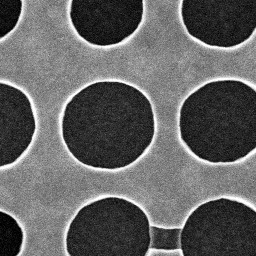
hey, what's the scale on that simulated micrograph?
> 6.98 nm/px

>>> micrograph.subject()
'holes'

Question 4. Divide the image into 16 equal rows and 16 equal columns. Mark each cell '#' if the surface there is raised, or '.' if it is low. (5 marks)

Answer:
.###.....##.....
.####....###....
#####...####...#
################
################
.####...####....
..##.....##.....
..##......#.....
..##......#.....
..##.....###....
######..########
################
######..#####..#
.####....###....
.###............
.###............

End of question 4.